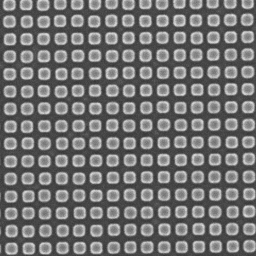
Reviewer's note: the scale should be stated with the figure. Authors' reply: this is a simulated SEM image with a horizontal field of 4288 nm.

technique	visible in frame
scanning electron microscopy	a regular array of raised bodies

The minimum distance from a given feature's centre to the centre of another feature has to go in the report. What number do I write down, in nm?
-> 280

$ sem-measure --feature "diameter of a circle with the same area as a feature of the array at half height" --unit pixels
12